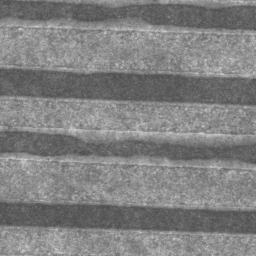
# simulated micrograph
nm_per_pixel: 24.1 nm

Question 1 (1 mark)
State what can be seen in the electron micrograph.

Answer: lines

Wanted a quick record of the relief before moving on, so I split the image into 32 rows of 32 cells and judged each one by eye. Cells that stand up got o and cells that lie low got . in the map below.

................................
................................
................................
oooooooooooooooooo..............
oooooooooooooooooooooooooooooooo
oooooooooooooooooooooooooooooooo
oooooooooooooooooooooooooooooooo
oooooooooooooooooooooooooooooooo
.......ooooooooooooooooooooooooo
................................
................................
................................
oooooo..........................
oooooooooooooooooooooooooooooooo
oooooooooooooooooooooooooooooooo
oooooooooooooooooooooooooooooooo
..........oooooooooooooooooooooo
................................
................................
................................
ooooooooooooooooooooo...........
oooooooooooooooooooooooooooooooo
oooooooooooooooooooooooooooooooo
oooooooooooooooooooooooooooooooo
oooooooooooooooooooooooooooooooo
..................oooooooooooooo
................................
................................
................................
oooooooooooooooooooooooooooooooo
oooooooooooooooooooooooooooooooo
oooooooooooooooooooooooooooooooo